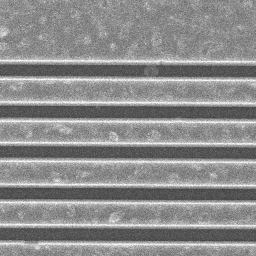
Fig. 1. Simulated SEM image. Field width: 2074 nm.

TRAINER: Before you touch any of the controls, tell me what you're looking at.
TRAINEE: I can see parallel lines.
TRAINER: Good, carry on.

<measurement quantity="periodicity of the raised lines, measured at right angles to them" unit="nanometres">332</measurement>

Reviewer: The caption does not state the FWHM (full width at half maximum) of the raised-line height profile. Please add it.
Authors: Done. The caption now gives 208 nanometers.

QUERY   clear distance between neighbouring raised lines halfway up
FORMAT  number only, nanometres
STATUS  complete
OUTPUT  128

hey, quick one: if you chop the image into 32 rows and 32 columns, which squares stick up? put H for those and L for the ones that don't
HHHHHHHHHHHHHHHHHHHHHHHHHHHHHHHH
HHHHHHHHHHHHHHHHHHHHHHHHHHHHHHHH
HHHHHHHHHHHHHHHHHHHHHHHHHHHHHHHH
HHHHHHHHHHHHHHHHHHHHHHHHHHHHHHHH
HHHHHHHHHHHHHHHHHHHHHHHHHHHHHHHH
HHHHHHHHHHHHHHHHHHHHHHHHHHHHHHHH
HHHHHHHHHHHHHHHHHHHHHHHHHHHHHHHH
HHHHHHHHHHHHHHHHHHHHHHHHHHHHHHHH
LLLLLLLLLLLLLLLLLLLLLLLLLLLLLLLL
LLLLLLLLLLLLLLLLLLLLLLLLLLLLLLLL
HHHHHHHHHHHHHHHHHHHHHHHHHHHHHHHH
HHHHHHHHHHHHHHHHHHHHHHHHHHHHHHHH
HHHHHHHHHHHHHHHHHHHHHHHHHHHHHHHH
LLLLLLLLLLLLLLLLLLLLLLLLLLLLLLLL
LLLLLLLLLLLLLLLLLLLLLLLLLLLLLLLL
HHHHHHHHHHHHHHHHHHHHHHHHHHHHHHHH
HHHHHHHHHHHHHHHHHHHHHHHHHHHHHHHH
HHHHHHHHHHHHHHHHHHHHHHHHHHHHHHHH
LLLLLLLLLLLLLLLLLLLLLLLLLLLLLLLL
LLLLLLLLLLLLLLLLLLLLLLLLLLLLLLLL
HHHHHHHHHHHHHHHHHHHHHHHHHHHHHHHH
HHHHHHHHHHHHHHHHHHHHHHHHHHHHHHHH
HHHHHHHHHHHHHHHHHHHHHHHHHHHHHHHH
LLLLLLLLLLLLLLLLLLLLLLLLLLLLLLLL
LLLLLLLLLLLLLLLLLLLLLLLLLLLLLLLL
HHHHHHHHHHHHHHHHHHHHHHHHHHHHHHHH
HHHHHHHHHHHHHHHHHHHHHHHHHHHHHHHH
HHHHHHHHHHHHHHHHHHHHHHHHHHHHHHHH
LLLLLLLLLLLLLLLLLLLLLLLLLLLLLLLL
LLLLLLLLLLLLLLLLLLLLLLLLLLLLLLLL
HHHHHHHHHHHHHHHHHHHHHHHHHHHHHHHH
HHHHHHHHHHHHHHHHHHHHHHHHHHHHHHHH